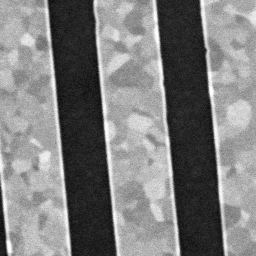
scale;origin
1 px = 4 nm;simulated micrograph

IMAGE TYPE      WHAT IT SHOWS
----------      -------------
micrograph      one or a few lines or trenches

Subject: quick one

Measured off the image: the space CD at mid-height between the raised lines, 188 nanometres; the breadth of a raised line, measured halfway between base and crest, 0.242 µm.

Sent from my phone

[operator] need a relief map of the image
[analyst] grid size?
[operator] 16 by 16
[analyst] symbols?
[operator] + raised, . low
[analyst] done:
+++...++++...+++
+++...++++...+++
+++...++++...+++
+++...++++...+++
+++...++++...+++
+++...++++...+++
++++..++++...+++
++++...+++...+++
++++...+++...+++
++++...++++...++
++++...++++...++
++++...++++...++
++++...++++...++
++++...++++...++
++++...++++...++
.+++...++++...++